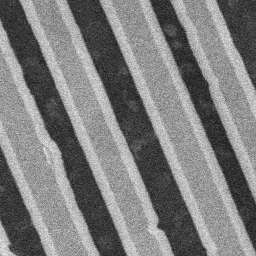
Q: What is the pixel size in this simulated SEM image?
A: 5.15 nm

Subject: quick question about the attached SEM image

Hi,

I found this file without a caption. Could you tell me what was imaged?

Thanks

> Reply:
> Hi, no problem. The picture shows one or a few lines or trenches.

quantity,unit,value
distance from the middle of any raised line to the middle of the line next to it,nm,370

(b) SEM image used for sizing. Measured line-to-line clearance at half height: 177 nm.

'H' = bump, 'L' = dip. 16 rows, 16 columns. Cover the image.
LLHHLLLHHLLHHLLL
LLHHHLLHHHLLHHLL
LLLHHLLLHHLLHHLL
HLLHHLLLHHHLHHHL
HLLHHHLLHHHLLHHL
HLLLHHLLLHHLLHHH
HHLLHHHLLHHHLLHH
HHLLLHHLLLHHLLHH
HHHLLHHLLLHHHLHH
HHHHLLHHLLHHHLLH
LHHHLLHHLLLHHLLH
LHHHLLHHHLLHHHLL
LLHHLLLHHLLLHHLL
LLHHHLLHHHLLHHHL
LLLHHLLLHHLLLHHL
LLLHHHLLHHLLLHHH